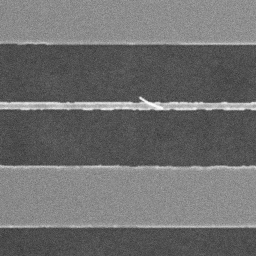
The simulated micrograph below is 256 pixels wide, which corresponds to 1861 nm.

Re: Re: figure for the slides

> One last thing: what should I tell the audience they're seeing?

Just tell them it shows lines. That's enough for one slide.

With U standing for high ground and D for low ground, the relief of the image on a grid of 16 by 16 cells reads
UUUUUUUUUUUUUUUU
UUUUUUUUUUUUUUUU
UUUUUUUUUUUUUUUU
DDDDDDDDDDDDDDDD
DDDDDDDDDDDDDDDD
DDDDDDDDDDDDDDDD
DDDDDDDDDDDDDDDD
DDDDDDDDDDDDDDDD
DDDDDDDDDDDDDDDD
DDDDDDDDDDDDDDDD
UUUUUUUUUUUUUUUU
UUUUUUUUUUUUUUUU
UUUUUUUUUUUUUUUU
UUUUUUUUUUUUUUUU
DDDDDDDDDDDDDDDD
DDDDDDDDDDDDDDDD